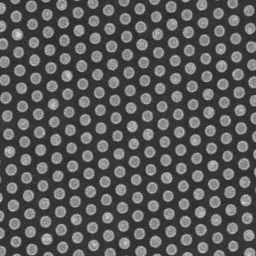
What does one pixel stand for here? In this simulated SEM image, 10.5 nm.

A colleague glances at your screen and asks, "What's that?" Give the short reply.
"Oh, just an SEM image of a regular array of raised bodies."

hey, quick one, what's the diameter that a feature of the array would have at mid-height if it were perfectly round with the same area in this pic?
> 11 pixels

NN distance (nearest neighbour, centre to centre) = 184 nm